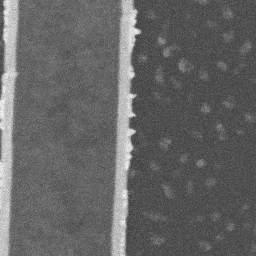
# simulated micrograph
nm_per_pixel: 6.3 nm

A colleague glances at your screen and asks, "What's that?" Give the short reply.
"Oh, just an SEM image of one or a few lines or trenches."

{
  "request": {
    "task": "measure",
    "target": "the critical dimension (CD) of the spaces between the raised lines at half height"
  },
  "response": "0.718 um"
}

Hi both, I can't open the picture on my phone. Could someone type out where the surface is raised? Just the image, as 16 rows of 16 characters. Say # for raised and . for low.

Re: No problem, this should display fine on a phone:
#.......########
#.......########
#.......########
#.......########
#.......########
#.......########
#.......########
........########
........########
........########
........########
........########
........########
.......#########
.......#########
.......#########